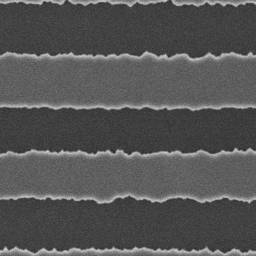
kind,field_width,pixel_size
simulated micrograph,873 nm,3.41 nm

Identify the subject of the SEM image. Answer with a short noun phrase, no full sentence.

lines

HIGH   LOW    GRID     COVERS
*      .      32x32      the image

..........*.....*.....***.*.**..
................................
................................
................................
................................
................................
................................
********************************
********************************
********************************
********************************
********************************
********************************
......**.***.**..*.*********..*.
................................
................................
................................
................................
................................
********************************
********************************
********************************
********************************
********************************
********************************
................................
................................
................................
................................
................................
................................
****.***********************.*.*